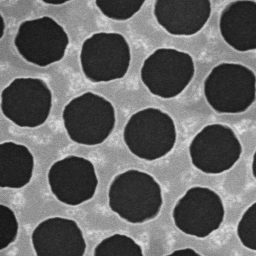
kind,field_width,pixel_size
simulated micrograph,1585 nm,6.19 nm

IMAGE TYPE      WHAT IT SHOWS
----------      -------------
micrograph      a regular array of holes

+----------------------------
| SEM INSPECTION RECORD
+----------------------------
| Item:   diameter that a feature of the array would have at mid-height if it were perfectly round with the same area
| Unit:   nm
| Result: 312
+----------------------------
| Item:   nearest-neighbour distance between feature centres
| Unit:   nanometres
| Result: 396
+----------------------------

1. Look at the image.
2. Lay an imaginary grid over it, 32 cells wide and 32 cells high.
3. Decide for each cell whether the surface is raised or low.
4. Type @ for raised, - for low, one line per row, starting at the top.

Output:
@@@@@@--@@@@------@-------@@@---
@@@@@@@@@@@@@----@@-------@@----
@@@@---@@@@@@@@@@@@@------@@----
@@------@@@@@@@@@@@@@----@@-----
@@------@@@@---@@@@@@@@@@@@@----
@@------@@------@@@@@@@@@@@@@---
@@------@@------@@@----@@@@@@@@@
@@@----@@@------@@------@@@@@@@@
@@@@@@@@@@------@@------@@@----@
@@@@@@@@@@@----@@@------@@------
@-----@@@@@@@@@@@@-----@@@------
------@@@@@@@@@@@@@----@@@------
------@@@----@@@@@@@@@@@@@------
------@@------@@@@@@@@@@@@@----@
@-----@@------@@@----@@@@@@@@@@@
@@---@@@------@@------@@@@@@@@@@
@@@@@@@@------@-------@@@----@@@
@@@@@@@@@----@@-------@@------@@
---@@@@@@@@@@@@@-----@@@------@@
----@@@@@@@@@@@@@---@@@@------@@
----@@@----@@@@@@@@@@@@@-----@@@
----@@------@@@@--@@@@@@@---@@@@
----@@------@@-----@@@@@@@@@@@@@
@@@@@@------@@------@@@@--@@@@@@
@@@@@@@-----@@------@@@----@@@@@
@@@@@@@@--@@@@------@@------@@@@
--@@@@@@@@@@@@------@@------@@@-
--@@@@---@@@@@@@--@@@@------@@--
--@@@-----@@@@@@@@@@@@-----@@@--
--@@------@@@@--@@@@@@@@--@@@@--
-@@@-------@-----@@@@@@@@@@@@@--
@@@@-------@------@@@@--@@@@@@@@